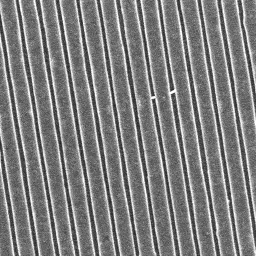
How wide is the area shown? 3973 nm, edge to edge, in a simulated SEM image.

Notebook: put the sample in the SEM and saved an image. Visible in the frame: parallel lines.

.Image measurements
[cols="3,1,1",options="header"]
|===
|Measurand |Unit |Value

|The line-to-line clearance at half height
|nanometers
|72.9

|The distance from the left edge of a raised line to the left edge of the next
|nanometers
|309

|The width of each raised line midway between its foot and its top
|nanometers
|232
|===